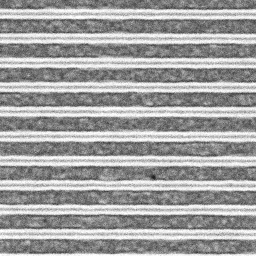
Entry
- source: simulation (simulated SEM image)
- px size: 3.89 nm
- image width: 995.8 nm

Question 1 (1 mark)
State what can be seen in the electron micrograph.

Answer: parallel lines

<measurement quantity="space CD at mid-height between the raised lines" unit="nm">68.1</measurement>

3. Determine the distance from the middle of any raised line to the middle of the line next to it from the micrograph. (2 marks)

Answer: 95.1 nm